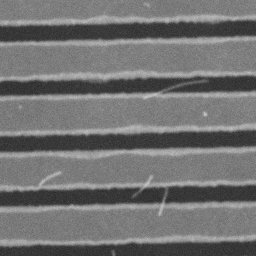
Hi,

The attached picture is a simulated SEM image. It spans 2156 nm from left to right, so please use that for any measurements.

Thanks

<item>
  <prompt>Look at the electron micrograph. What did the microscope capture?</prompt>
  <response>lines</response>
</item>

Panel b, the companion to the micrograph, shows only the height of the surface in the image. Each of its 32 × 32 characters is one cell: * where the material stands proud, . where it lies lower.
********************************
********************************
**********************..........
................................
................................
********************************
********************************
********************************
********************************
*****************.******........
................................
................................
********************************
********************************
********************************
********************************
**************..................
................................
................................
********************************
********************************
********************************
********************************
**********......................
................................
....................*...********
********************************
********************************
********************************
********************************
*...............................
................................